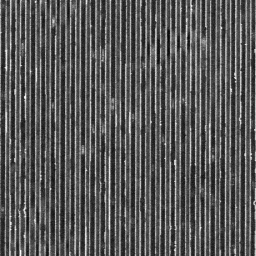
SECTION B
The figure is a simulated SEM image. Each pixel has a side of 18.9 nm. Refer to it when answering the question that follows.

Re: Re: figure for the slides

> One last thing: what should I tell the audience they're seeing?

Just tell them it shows parallel lines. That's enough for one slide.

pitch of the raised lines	10	px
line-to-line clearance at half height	0.0781	µm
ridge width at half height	118	nanometers